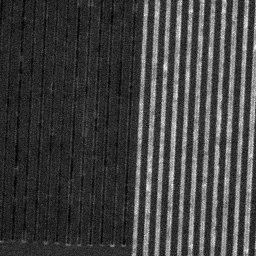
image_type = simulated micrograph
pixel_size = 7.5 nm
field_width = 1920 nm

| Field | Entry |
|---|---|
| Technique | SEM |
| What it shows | parallel lines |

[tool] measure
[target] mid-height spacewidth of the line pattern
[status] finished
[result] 56.1 nm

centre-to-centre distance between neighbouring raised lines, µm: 0.0834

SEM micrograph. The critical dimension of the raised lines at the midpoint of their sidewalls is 25.3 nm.